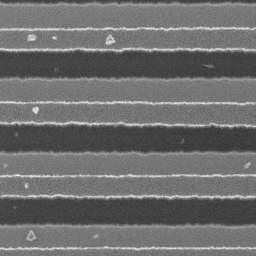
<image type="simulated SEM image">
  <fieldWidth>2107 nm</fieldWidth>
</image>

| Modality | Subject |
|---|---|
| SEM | lines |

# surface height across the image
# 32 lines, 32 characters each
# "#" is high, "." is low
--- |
...........#................#...
################################
################################
################################
################################
################################
................................
................................
................................
................................
################################
################################
################################
################################
################################
.......#...##.##################
................................
................................
................................
################################
################################
################################
################################
################################
################################
................................
................................
................................
################################
################################
################################
################################